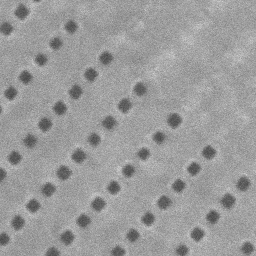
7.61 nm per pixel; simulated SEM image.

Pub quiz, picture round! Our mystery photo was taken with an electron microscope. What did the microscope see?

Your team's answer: a regular array of holes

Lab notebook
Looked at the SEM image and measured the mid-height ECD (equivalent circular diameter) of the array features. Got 107 nanometers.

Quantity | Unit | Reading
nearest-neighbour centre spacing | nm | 171